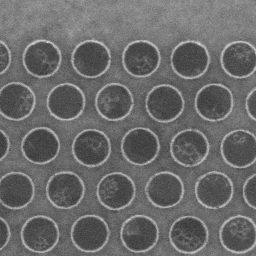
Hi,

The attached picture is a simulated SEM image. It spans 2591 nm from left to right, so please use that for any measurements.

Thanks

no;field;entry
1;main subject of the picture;a regular array of raised bodies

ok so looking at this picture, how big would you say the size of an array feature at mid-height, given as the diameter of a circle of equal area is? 374 nm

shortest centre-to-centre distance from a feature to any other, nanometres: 495